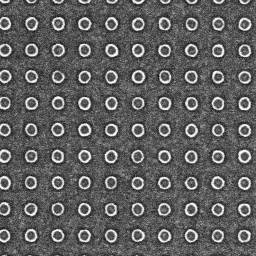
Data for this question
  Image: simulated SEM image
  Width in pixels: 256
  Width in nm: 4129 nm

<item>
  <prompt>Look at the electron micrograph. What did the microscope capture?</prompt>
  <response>a regular array of raised bodies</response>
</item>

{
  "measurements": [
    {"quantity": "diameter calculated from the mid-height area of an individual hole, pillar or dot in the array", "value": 11.5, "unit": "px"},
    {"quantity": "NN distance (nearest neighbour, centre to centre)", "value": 421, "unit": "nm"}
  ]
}